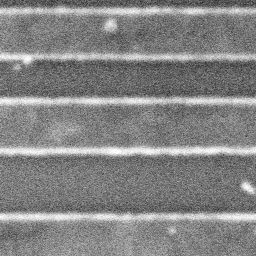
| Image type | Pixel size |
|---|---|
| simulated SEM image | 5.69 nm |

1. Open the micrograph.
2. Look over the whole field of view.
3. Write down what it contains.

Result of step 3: lines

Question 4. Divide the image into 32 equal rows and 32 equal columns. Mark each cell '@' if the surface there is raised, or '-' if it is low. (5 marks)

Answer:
--------------------------------
@@@@@@@@@@@@@@@@@@@@@@@@@@@@@@@@
@@@@@@@@@@@@@@@@@@@@@@@@@@@@@@@@
@@@@@@@@@@@@@@@@@@@@@@@@@@@@@@@@
@@@@@@@@@@@@@@@@@@@@@@@@@@@@@@@@
@@@@@@@@@@@@@@@@@@@@@@@@@@@@@@@@
@@@@@@@@@@@@@@@@@@@@@@@@@@@@@@@@
--------------------------------
--------------------------------
--------------------------------
--------------------------------
--------------------------------
---------------------@@---------
@@@@@@@@@@@@@@@@@@@@@@@@@@@@@@@@
@@@@@@@@@@@@@@@@@@@@@@@@@@@@@@@@
@@@@@@@@@@@@@@@@@@@@@@@@@@@@@@@@
@@@@@@@@@@@@@@@@@@@@@@@@@@@@@@@@
@@@@@@@@@@@@@@@@@@@@@@@@@@@@@@@@
@@@@@@@@@@@@@@@@@@@@@@@@@@@@@@@@
--------------------------------
--------------------------------
--------------------------------
--------------------------------
--------------------------------
--------------------------------
--------------------------------
--------------------------------
@@@@@@@@@@@@@@@@@@@@@@@@@@@@@@@@
@@@@@@@@@@@@@@@@@@@@@@@@@@@@@@@@
@@@@@@@@@@@@@@@@@@@@@@@@@@@@@@@@
@@@@@@@@@@@@@@@@@@@@@@@@@@@@@@@@
@@@@@@@@@@@@@@@@@@@@@@@@@@@@@@@@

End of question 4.